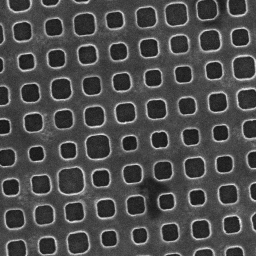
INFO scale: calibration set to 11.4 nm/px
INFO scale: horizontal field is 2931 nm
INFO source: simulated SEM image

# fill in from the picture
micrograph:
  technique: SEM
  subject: a regular array of holes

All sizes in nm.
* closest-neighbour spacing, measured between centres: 347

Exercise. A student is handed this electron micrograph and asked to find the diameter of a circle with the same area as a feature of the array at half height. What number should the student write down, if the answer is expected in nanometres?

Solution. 218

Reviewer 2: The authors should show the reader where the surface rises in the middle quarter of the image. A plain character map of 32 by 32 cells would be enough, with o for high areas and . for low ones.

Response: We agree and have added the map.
oooooooooooooooooooooooooooooo.o
oooooooooooooooooooooo..oooo....
ooooooooooooo...oooo....oooo....
ooooo....ooo....oooo....oooo....
.oooo....ooo.....ooo....ooooo..o
..ooo....ooo.....oooo..ooooooooo
..ooo....oooo...oooooooooooooooo
..oooo..oooooooooooooooooooooooo
.ooooooooooooooooooooooooooooo..
ooooooooooooooooooooo....oooo...
ooooooooooooo....oooo....oooo...
.oooo.....ooo.....ooo.....ooo...
..ooo.....ooo.....ooo.....oooo..
..ooo.....ooo.....oooo..oooooooo
..ooo.....oooo.o.ooooooooooooooo
..oooo..oooooooooooooooooooooooo
oooooooooooooooooooooooooooooo..
oooooooooooooooooooooo....oooo..
oooooo.....oooo...oooo....oooo..
oooooo.....oooo...oooo....oooo..
...oo......oooo...oooo....oooooo
...ooo......ooo...oooooooooooooo
...ooo.....ooooooooooooooooooooo
..ooooo...oooooooooooooooooooooo
oooooooooooooooooooooooo..oooo..
oooooooooooooooo...oooo....ooo..
....oooo..ooooo....ooo.....ooo..
.....oo....oooo.....ooo....oooo.
.....oo....oooo....oooo....ooooo
.....oo....oooo...oooooooooooooo
.....ooo...ooooooooooooooooooooo
.....ooooooooooooooooooooooooooo